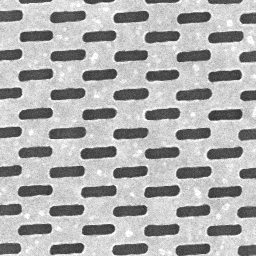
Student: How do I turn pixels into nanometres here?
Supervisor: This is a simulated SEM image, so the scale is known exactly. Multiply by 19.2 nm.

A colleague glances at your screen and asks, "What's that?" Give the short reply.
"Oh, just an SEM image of a regular array of holes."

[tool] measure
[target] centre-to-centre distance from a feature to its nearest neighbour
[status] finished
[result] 705 nm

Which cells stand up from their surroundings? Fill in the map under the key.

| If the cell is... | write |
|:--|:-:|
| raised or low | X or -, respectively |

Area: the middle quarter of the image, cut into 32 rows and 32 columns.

XXXXXXXXXXXXXXXXXXXXXXXXXXXXXXXX
XXXXXXX------XXXXXXXXXXX----XXXX
XXXXX--------XXXXXXXX--------XXX
XXXXX--------XXXXXXX---------XXX
XXXXXXXXXXXXXXXXXXXXXXXXXXXXXXXX
XXXXXXXXXXXXXXXXXXXXXXXXXXXXXXXX
-----XXXXXXXXX-------XXXXXXXXX--
-----XXXXXXX---------XXXXXXX----
----XXXXXXXX---------XXXXXXX----
XXXXXXXXXXXXXXXXXXXXXXXXXXXXXXXX
XXXXXXXXXXXXXXXXXXXXXXXXXXXXXXXX
XXXXX--------XXXXXXXXX-------XXX
XXXXX--------XXXXXXX---------XXX
XXXX--------XXXXXXXX--------XXXX
XXXXXXXXXXXXXXXXXXXXXXXXXXXXXXXX
XXXXXXXXXXXXXXXXXXXXXXXXXXXXXXXX
-----XXXXXXXX--------XXXXXXXX---
-----XXXXXXX---------XXXXXXX----
----XXXXXXXX--------XXXXXXXX----
XXXXXXXXXXXXXXXXXXXXXXXXXXXXXXXX
XXXXXXXXXXXXXXXXXXXXXXXXXXXXXXXX
XXXX---------XXXXXXXX--------XXX
XXXX---------XXXXXXX---------XXX
XXXX--------XXXXXXXXX------XXXXX
XXXXXXXXXXXXXXXXXXXXXXXXXXXXXXXX
----XXXXXXXXXXXXXXX-XXXXXXXXXXXX
-----XXXXXXXX--------XXXXXXX----
-----XXXXXXX---------XXXXXXX----
XXXXXXXXXXXXX-----XXXXXXXXXX----
XXXXXXXXXXXXXXXXXXXXXXXXXXXXXXXX
XXXXXX-------XXXXXXXXXXX-----XXX
XXXX---------XXXXXXX---------XXX